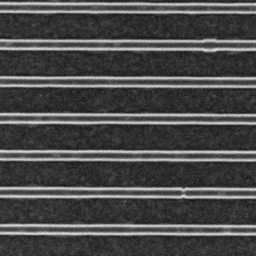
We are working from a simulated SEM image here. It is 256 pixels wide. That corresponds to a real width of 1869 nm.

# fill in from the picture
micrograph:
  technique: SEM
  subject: parallel lines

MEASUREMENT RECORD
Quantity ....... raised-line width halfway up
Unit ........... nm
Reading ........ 66.6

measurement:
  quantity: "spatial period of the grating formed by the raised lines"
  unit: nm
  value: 270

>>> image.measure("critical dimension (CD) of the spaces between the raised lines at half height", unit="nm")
202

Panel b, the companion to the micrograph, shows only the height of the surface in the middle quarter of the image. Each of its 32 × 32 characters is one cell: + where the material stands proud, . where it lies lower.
................................
................................
................................
++++++++++++++++++++++++++++++++
++++++++++++++++++++++++++++++++
..................++++++++++++++
................................
................................
................................
................................
................................
................................
................................
++++++++++++++++++++++++++++++++
++++++++++++++++++++++++++++++++
................................
................................
................................
................................
................................
................................
................................
++++++++++++++++++++++++++++++++
++++++++++++++++++++++++++++++++
................................
................................
................................
................................
................................
................................
................................
++++++++++++++++++++++++++++++++